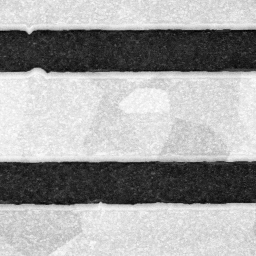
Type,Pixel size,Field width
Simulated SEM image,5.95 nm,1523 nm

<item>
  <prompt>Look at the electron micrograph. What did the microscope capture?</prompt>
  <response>one or a few lines or trenches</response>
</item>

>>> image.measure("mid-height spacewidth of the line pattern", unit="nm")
280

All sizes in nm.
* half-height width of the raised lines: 506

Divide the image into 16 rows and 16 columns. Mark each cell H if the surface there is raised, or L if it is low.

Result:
HHHHHHHHHHHHHHHH
HHHHHHHHHHHHHHHH
LLLLLLLLLLLLLLLL
LLLLLLLLLLLLLLLL
LLHLLLLLLLLLLLLL
HHHHHHHHHHHHHHHH
HHHHHHHHHHHHHHHH
HHHHHHHHHHHHHHHH
HHHHHHHHHHHHHHHH
HHHHHHHHHHHHHHHH
LLLLLLLLLLLLLLLL
LLLLLLLLLLLLLLLL
LLLLLLLLLLLLLLLL
HHHHHHHHHHHHHHHH
HHHHHHHHHHHHHHHH
HHHHHHHHHHHHHHHH